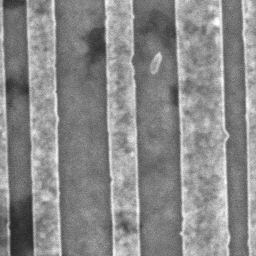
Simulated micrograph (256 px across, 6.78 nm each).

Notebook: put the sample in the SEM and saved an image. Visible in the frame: one or a few lines or trenches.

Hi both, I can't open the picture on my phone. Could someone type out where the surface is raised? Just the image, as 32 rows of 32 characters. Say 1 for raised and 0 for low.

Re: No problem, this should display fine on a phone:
00011110000001110000001111110011
00011110000001111000001111110011
00001110000001111000001111110011
00001110000001111000001111110001
00001110000001111000001111110011
00001110000001111000001111110001
00001110000001111000001111110001
00001110000001110000001111110001
00001110000001111000001111110001
00001110000001111000001111110001
00001110000001111000001111110001
10001110000000111000001111110001
10001110000000111000001111110001
10001110000000111000001111110001
10001110000001111000000111110001
10001110000000111000000111110001
10001110000000111000000111110001
10001110000000111000000111110001
10001110000000111000000111110001
10001110000000111000000111110001
10001110000000111000000111110001
10001110000000111000000111110001
10001110000000111000000111110001
10001110000000111000000111110001
10001110000000111000000111110001
10001110000000111000000111110001
10001110000000111000000111110001
10001110000000111000000111110001
10001110000000111000000111110001
10001110000000111000000111111001
10001111000000111000000111111001
10001111000000111000000111110001